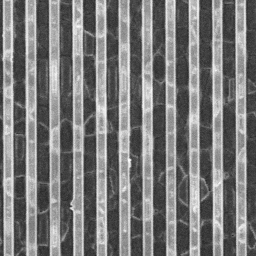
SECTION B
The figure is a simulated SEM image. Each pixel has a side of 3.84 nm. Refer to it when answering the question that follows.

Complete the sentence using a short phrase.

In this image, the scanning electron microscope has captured parallel lines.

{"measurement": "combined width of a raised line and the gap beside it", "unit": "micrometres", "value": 0.0895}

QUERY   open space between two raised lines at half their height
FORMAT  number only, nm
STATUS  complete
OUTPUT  56.2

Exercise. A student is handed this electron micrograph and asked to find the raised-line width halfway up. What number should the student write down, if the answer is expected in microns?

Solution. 0.0336